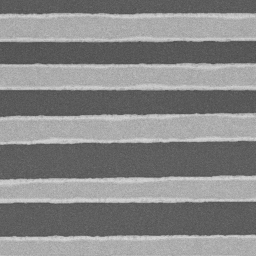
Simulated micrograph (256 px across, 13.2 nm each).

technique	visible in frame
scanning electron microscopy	lines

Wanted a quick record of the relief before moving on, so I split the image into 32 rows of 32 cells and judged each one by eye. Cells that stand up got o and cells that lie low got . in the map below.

................................
................................
oooooooooooooooooooooooooooooooo
oooooooooooooooooooooooooooooooo
oooooooooooooooooooooooooooooooo
................................
................................
................................
oooooooooooooooooooooooooooooooo
oooooooooooooooooooooooooooooooo
oooooooooooooooooooooooooooooooo
................................
................................
................................
..................oo.ooooooooooo
oooooooooooooooooooooooooooooooo
oooooooooooooooooooooooooooooooo
ooooooooooooooooooooooooo.......
................................
................................
................................
................................
.............oo.oooooooooooooooo
oooooooooooooooooooooooooooooooo
oooooooooooooooooooooooooooooooo
................................
................................
................................
................................
................................
oooooooooooooooooooooooooooooooo
oooooooooooooooooooooooooooooooo